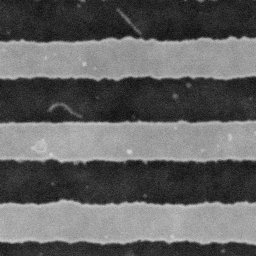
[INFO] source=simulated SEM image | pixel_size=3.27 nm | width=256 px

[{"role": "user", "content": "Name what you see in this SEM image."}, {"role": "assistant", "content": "lines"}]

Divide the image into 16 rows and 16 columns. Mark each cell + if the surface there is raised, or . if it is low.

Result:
................
................
......+++...++++
++++++++++++++++
++++++++++++++++
................
................
................
++++++++++++++++
++++++++++++++++
................
................
................
++++++++++++++++
++++++++++++++++
................